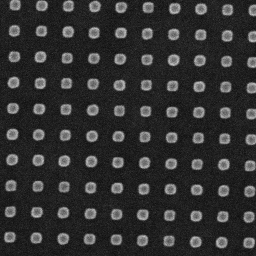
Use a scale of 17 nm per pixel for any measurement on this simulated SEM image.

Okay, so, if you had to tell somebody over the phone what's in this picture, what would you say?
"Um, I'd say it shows a regular array of raised bodies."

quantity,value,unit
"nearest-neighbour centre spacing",435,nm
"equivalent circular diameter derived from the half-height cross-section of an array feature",183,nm